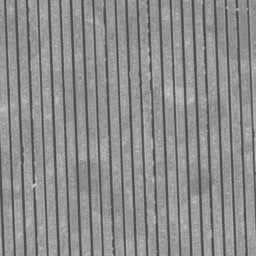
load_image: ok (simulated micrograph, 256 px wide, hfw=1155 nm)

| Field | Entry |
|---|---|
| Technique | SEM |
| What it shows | parallel lines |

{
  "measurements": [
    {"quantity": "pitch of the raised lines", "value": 0.0498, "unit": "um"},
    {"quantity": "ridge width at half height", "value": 38.3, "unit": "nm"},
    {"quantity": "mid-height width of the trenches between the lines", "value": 2.88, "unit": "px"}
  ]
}